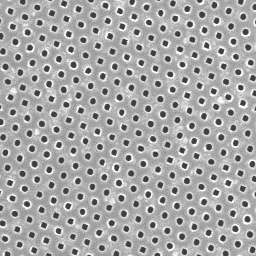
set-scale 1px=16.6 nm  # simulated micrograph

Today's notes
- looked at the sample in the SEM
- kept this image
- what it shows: a regular array of holes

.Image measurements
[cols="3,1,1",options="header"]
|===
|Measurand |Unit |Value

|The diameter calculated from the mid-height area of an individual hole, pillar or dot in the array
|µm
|0.108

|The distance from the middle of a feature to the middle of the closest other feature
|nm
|255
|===